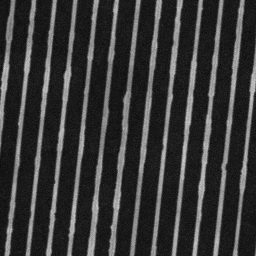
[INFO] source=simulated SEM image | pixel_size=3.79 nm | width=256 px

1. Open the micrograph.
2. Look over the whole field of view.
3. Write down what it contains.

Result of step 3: parallel lines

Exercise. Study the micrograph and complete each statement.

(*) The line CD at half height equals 15.1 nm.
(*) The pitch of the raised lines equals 78.2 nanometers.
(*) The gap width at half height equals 59.8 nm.